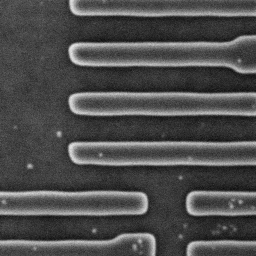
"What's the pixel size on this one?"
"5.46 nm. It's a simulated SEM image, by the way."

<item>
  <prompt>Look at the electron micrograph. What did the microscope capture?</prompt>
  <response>wiring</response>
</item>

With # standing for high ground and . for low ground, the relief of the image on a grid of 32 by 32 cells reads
.........#######################
.........#######################
................................
................................
................................
.........#######################
.........#######################
.........#######################
.............................###
................................
................................
................................
.........#######################
.........#######################
................................
................................
................................
................................
.........#######################
.........#######################
............####################
................................
................................
................................
##################......########
##################.....#########
##################......########
................................
................................
...............####.............
###################.....########
###################....#########